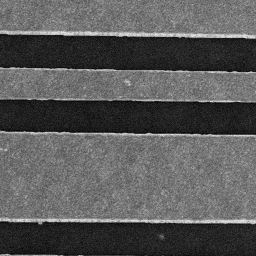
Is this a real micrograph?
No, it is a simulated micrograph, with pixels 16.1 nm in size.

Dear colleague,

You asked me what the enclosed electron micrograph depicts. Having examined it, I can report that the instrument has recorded lines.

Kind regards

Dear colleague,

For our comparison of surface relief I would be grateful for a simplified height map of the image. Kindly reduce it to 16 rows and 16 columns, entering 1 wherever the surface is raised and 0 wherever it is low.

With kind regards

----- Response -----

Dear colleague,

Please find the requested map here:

1111111111111111
1111111111111111
0000000000000000
0000000000000000
1111111111111110
1111111111111111
0000000000000000
0000000000000000
1111111111111111
1111111111111111
1111111111111111
1111111111111111
1111111111111111
1111111111111111
0000000000000000
0000000000000000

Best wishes